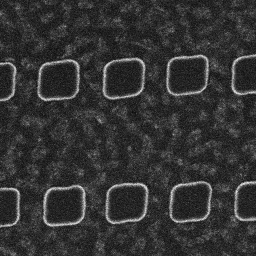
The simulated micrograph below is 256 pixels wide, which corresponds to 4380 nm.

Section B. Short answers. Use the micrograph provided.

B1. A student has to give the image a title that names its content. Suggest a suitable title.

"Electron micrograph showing raised bodies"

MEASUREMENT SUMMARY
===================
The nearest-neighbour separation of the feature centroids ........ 63.8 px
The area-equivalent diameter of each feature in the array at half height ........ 720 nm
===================